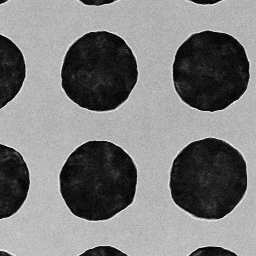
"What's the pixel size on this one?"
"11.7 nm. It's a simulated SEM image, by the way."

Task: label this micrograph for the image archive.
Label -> holes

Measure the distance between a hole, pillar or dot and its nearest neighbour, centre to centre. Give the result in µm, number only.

1.27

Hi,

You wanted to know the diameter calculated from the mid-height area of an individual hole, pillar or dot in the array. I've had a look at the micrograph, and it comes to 79.1 px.